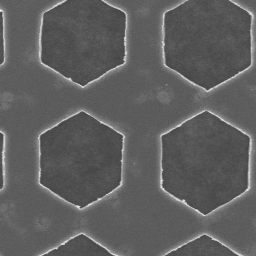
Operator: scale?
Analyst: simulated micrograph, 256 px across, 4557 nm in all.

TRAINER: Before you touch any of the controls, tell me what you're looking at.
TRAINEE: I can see holes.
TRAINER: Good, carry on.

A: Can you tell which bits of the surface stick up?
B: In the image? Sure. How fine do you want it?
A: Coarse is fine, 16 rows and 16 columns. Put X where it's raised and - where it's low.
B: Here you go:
XXX----XXXX----X
XXX-----XX------
XXX-----XX------
XXX-----XX------
XXXX---XXXX----X
XXXXXXXXXXXXXXXX
XXXXXXXXXXXXXXXX
XXXX--XXXXXX--XX
XXX-----XX-----X
XXX-----XX------
XXX-----XX------
XXX----XXX------
XXXX--XXXXX---XX
XXXXXXXXXXXXXXXX
XXXXXXXXXXXXXXXX
XXXX--XXXXX---XX